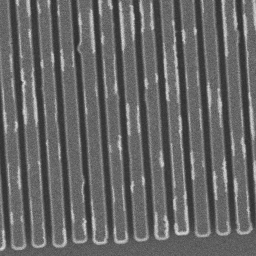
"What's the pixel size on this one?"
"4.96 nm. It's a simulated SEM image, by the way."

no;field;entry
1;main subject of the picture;parallel lines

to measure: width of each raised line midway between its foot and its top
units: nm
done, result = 68.7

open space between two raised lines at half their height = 32.2 nm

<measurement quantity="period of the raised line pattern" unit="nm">102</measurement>